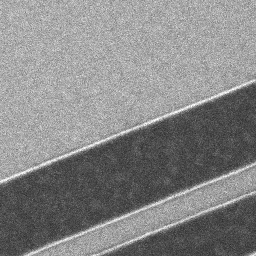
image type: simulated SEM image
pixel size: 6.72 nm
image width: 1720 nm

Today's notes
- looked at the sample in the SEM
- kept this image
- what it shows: one or a few lines or trenches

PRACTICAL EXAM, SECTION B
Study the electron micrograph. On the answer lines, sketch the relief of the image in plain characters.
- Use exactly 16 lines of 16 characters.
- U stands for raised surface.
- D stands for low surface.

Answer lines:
DDDDDDDDDDDDDDDD
DDDDDDDDDDDDDDDD
DDDDDDDDDDDDDDDD
DDDDDDDDDDDDDDDD
DDDDDDDDDDDDDDDD
DDDDDDDDDDDDDDDU
DDDDDDDDDDDDUUUU
DDDDDDDDDDUUUUUU
DDDDDDDUUUUUUUUU
DDDDDUUUUUUUUUUU
DDUUUUUUUUUUUUUD
UUUUUUUUUUUUUDDD
UUUUUUUUUUDDDDDU
UUUUUUUUDDDDUUUU
UUUUUDDDDUUUUUUU
UUUDDDDUUUUUUUUU